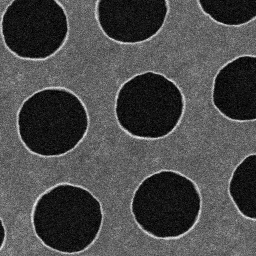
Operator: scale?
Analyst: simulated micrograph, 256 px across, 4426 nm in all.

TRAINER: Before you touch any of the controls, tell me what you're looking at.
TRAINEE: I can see holes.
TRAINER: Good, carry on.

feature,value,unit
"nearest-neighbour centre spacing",1.69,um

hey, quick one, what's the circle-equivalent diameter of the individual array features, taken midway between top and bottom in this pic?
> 1160 nm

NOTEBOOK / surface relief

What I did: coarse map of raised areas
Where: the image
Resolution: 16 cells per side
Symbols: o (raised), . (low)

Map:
o...oo....ooo...
....oo....oooo.o
....ooo..ooooooo
o..ooooooooooooo
oooooooooooooo..
oooooooo...oo...
oo...oo....oo...
o....oo....oooo.
o....oooo.oooooo
oo..oooooooooooo
ooooooooooooooo.
ooooooooo...oo..
oo....oo....ooo.
oo....oo....ooo.
oo....ooo...oooo
ooo..ooooooooooo